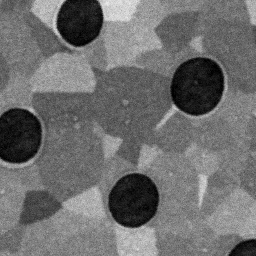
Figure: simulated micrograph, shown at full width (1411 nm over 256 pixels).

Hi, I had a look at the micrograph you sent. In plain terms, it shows holes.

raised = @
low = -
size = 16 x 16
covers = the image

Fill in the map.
@@@@--@@@@@@@@@@
@@@@--@@@@@@@@@@
@@@@--@@@@@@@@@@
@@@@@@@@@@@@@@@@
@@@@@@@@@@@---@@
@@@@@@@@@@@---@@
@@@@@@@@@@@---@@
--@@@@@@@@@@@@@@
---@@@@@@@@@@@@@
--@@@@@@@@@@@@@@
@@@@@@@@@@@@@@@@
@@@@@@@---@@@@@@
@@@@@@@---@@@@@@
@@@@@@@---@@@@@@
@@@@@@@@@@@@@@@@
@@@@@@@@@@@@@@@-